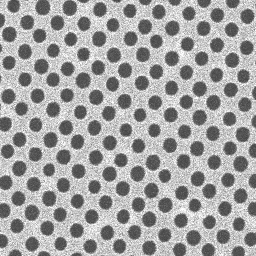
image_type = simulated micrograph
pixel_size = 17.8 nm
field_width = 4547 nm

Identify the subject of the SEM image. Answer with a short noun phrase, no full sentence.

a regular array of holes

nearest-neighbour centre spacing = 349 nm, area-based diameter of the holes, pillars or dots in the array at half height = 0.264 um